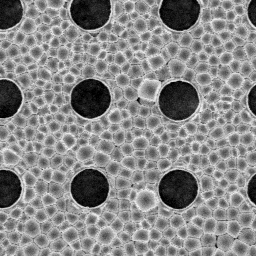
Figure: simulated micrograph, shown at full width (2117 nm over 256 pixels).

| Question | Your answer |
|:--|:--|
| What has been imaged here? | holes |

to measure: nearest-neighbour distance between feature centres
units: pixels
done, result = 88.1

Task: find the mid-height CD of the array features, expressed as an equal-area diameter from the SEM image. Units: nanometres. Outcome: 334